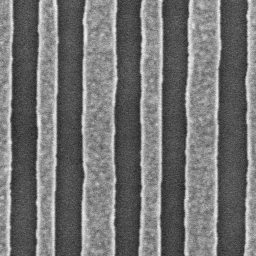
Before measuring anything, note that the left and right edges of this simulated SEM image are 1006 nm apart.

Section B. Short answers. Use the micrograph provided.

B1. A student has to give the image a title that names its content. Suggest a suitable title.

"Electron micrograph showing lines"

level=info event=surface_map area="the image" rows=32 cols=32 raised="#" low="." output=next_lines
#....##....####...##....###....#
#....##....####...##....###....#
#....##...####....##....###....#
#....##....###....##....###....#
#....##....###....##....###....#
#....##....###....##....####...#
#....##....###....##....###....#
#....##...#####...##....###....#
#....##...#####...##....###....#
#....##...#####...##....###....#
#....##...#####...##...####....#
#....##...####....##...####....#
#....##...####....##...####....#
#....##...####....##...####....#
#....##...####....##...####....#
#....##...####....##...####....#
#....##...####....##...####....#
#....##...####....##...####....#
#....##...####....##...####....#
#....##...####....##...####....#
#....##...####....##...####....#
#....##....###....##...####....#
#....##....###....##...####....#
#....##...####....##...####....#
#....##...####....##...####....#
#....##...####....##...####....#
#....##...####....##...####....#
#....##...####....##...####....#
#....##...####....##...####....#
#....##...####....##...####....#
#....##...####....##...####....#
#....##...####...###...####....#